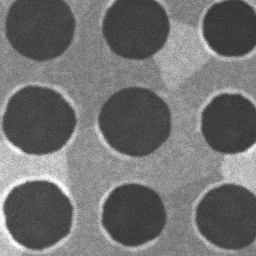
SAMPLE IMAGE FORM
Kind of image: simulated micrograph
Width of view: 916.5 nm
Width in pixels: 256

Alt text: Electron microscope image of holes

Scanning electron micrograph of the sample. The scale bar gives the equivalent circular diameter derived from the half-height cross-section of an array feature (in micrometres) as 0.253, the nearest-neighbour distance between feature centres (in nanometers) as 334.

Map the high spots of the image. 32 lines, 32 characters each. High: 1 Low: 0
10000000111111000000111111100001
10000000011110000000011111000000
10000000011110000000011110000000
10000000011110000000011110000000
10000000011110000000011110000000
10000000011110000000011111000000
11000000111111000000111111100001
11110011111111111011111111111111
11111111111111111111111111111111
11111111111111111111111111111111
11111111111111111111111111111111
11000001111111000001111111111111
10000000111110000000111111000001
10000000011110000000011111000000
00000000001100000000011110000000
00000000001100000000011110000000
00000000011110000000011110000000
10000000011110000000011111000000
11000000111111000000111111000001
11111111111111110011111111111111
11111111111111111111111111111111
11111111111111111111111111111111
11111111111111111111111111111111
11000000111111000001111111100001
10000000111111000000111110000000
00000000011110000000111110000000
00000000011110000000011100000000
10000000011110000000011100000000
10000000011110000000011110000000
10000000111111000000111110000000
11000001111111100011111111100001
11111111111111111111111111111111